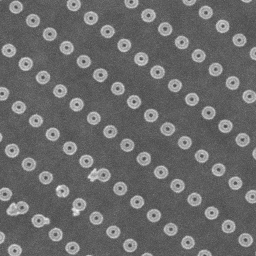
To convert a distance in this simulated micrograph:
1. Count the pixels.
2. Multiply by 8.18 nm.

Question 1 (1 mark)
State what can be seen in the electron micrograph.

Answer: a regular array of ring-shaped raised bodies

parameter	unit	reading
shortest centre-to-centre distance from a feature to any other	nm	176